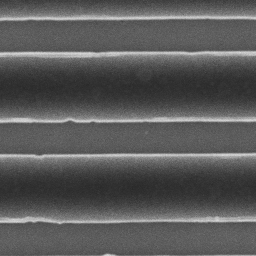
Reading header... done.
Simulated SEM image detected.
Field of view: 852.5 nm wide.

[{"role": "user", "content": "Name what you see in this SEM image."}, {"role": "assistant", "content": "one or a few lines or trenches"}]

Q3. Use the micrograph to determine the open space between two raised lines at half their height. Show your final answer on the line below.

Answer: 33.3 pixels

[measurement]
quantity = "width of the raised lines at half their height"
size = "227 nm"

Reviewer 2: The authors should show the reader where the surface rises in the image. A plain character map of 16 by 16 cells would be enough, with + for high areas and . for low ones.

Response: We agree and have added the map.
++++++++++++++++
................
................
++++++++++++++++
++++++++++++++++
++++++++++++++++
++++++++++++++++
++++++++++++++++
................
................
++++++++++++++++
++++++++++++++++
++++++++++++++++
++++++++++++++++
................
................